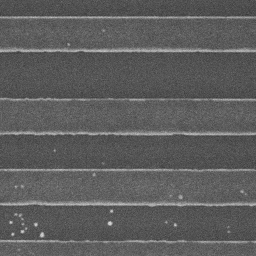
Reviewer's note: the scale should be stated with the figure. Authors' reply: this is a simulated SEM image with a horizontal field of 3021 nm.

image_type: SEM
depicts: lines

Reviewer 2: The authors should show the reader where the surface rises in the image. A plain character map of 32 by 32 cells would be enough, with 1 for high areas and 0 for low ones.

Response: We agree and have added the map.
00000000000000000000000000000000
00000000000000000000000000000000
11111111111111111111111111111111
11111111111111111111111111111111
11111111111111111111111111111111
11111111111111111111111111111111
00000000000000000000000000000000
00000000000000000000000000000000
00000000000000000000000000000000
00000000000000000000000000000000
00000000000000000000000000000000
00000000000000000000000000000000
11111111111111111111111111111111
11111111111111111111111111111111
11111111111111111111111111111111
11111111111111111111111111111111
11111111111111111111111111111111
00000000000000000000000000000000
00000000000000000000000000000000
00000000000000000000000000000000
00000000000000000000000000000000
11111111111111111111111111111111
11111111111111111111111111111111
11111111111111111111111111111111
11111111111111111111111111111111
01100011001000111111111111111111
00000000000000000000000000000000
00000000000000000000000000000000
00000000000000000000000000000000
00000000000000000000000000000000
11111111111111111111111111111111
11111111111111111111111111111111